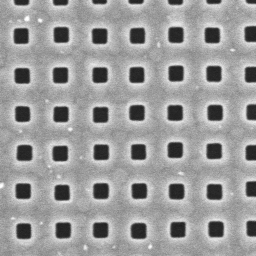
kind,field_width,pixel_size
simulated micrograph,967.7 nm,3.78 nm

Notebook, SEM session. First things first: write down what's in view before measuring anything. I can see a regular array of holes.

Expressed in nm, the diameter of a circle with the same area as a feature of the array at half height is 63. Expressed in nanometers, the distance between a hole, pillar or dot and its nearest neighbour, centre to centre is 143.